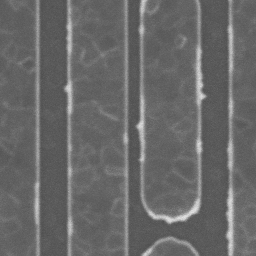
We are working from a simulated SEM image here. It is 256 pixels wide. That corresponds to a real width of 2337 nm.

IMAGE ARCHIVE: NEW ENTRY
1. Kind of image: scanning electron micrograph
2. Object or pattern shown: one or a few lines or trenches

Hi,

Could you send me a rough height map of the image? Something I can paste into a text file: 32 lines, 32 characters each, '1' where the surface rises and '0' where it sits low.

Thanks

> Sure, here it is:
11111000011111110011111110000111
11111000011111110011111110000111
11111000011111110011111110000111
11111000111111110111111110000111
11111000111111110011111110000111
11111000111111110011111110000111
11111000111111110011111110000111
11111000011111110011111110000111
11111000011111110011111110000111
11111000011111110011111110000111
11111000111111110011111110000111
11111000111111110011111110000111
11111000011111110011111110000111
11111000111111110011111110000111
11111000011111110011111110000111
11111000011111110111111110000111
11111000011111110111111110000111
11111000011111110111111110000111
11111000011111110011111110001111
11111000011111110011111110001111
11111000011111110011111110001111
11111000011111110011111110000111
11111000011111110011111110000111
11111000011111110011111110000111
11111000011111110011111110000111
11111000011111110011111110001111
11111000011111110011111110001111
11111000011111110000011000001111
11111000011111110000000000001111
11111000011111110000000000001111
11111000011111110000111000000111
11111000011111110011111100000111